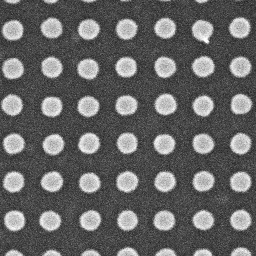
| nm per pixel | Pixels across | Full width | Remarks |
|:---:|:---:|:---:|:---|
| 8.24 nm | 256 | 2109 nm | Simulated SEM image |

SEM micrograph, a regular array of raised bodies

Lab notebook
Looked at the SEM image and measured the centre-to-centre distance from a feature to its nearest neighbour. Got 37.1 px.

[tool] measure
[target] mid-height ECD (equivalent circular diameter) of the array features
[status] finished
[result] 159 nm